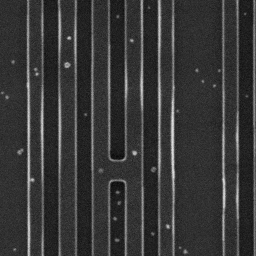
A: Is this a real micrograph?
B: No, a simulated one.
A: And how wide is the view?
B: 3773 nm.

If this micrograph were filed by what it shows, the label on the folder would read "groups of lines, slits or small figures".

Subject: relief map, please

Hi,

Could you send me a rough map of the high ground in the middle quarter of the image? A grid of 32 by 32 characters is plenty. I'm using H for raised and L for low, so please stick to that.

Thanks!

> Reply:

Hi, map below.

HHHLLLLHHHHLLLLHHHHLLLLLHHHLLLLL
HHHLLLLHHHHLLLLHHHHLLLLLHHHLLLLL
HHHLLLLHHHHLLLLHHHHLLLLLHHHLLLLL
HHHLLLLHHHHLLLLHHHHLLLLLHHHLLLLL
HHHLLLLHHHHLLLLHHHHLLLLLHHHLLLLL
HHHLLLLHHHHLLLLLHHHLLLLLHHHLLLLL
HHHLLLLHHHHLLLLHHHHLLLLLHHHLLLLL
HHHLLLLHHHHLLLLHHHHLLLLLHHHLLLLL
HHHLLLLHHHHLLLLHHHHLLLLLHHHLLLLL
HHHLLLLHHHHLLLLHHHHLLLLLHHHLLLLL
HHHLLLLHHHHLLLLHHHHLLLLLHHHLLLLL
HHHLLLLHHHHLLLLHHHHLLLLLHHHLLLLL
HHHLLLLHHHHLLLLHHHHHLLLLHHHLLLLL
HHHLLLLHHHHLLLLHHHHHLLLLHHHLLLLL
HHHLLLLHHHHLLLLHHHHHLLLLHHHLLLLL
HHHLLLLHHHHLLLLHHHHHLLLLHHHLLLLL
HHHLLLLHHHHLLLLHHHHHLLLLHHHLLLLL
HHHLLLLHHHHLLLLHHHHHLLLLHHHLLLLL
HHHLLLLHHHHLLLLHHHHHLLLLHHHLLLLL
HHHLLLLHHHHLLLLHHHHHLLLLHHHLLLLL
HHHLLLLHHHHLLLLHHHHHLLLLHHHLLLLL
HHHLLLLHHHHLLLLHHHHHLLLLHHHLLLLL
HHHLLLLHHHHLLLLHHHHHLLLLHHHLLLLL
HHHLLLLHHHHHLLLHHHHHLLLLHHHLLLLL
HHHLLLLHHHHHHHHHHHHHLLLLHHHLLLLL
HHHLLLLHHHHHHHHHHHHHLLLLHHHLLLLL
HHHLLLLHHHHHHHHHHHHHLLLLHHHLLLLL
HHHLLLLHHHHHHHHHHHHHLLLLHHHLLLLL
HHHLLLLHHHHHHHHHHHHHLLLLHHHLLLLL
HHHLLLLHHHHHLLLHHHHHLLLLHHHLLLLL
HHHLLLLHHHHLLLLHHHHHLLLLHHHLLLLL
HHHLLLLHHHHLLLLHHHHHLLLLHHHLLLLL